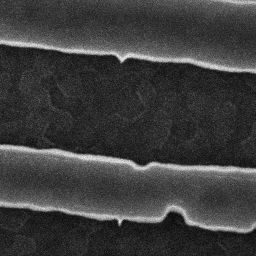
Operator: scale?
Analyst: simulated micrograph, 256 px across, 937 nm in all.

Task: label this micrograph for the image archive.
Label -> one or a few lines or trenches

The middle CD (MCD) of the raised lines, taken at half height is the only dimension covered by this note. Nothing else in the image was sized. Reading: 211 nm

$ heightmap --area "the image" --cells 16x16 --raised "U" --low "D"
UUUUUUUUUUUUUUUU
UUUUUUUUUUUUUUUU
UUUUUUUUUUUUUUUU
DDDDDDDUUUUUUUUU
DDDDDDDDDDDDDDDD
DDDDDDDDDDDDDDDD
DDDDDDDDDDDDDDDD
DDDDDDDDDDDDDDDD
DDDDDDDDDDDDDDDD
UUUUDDDDDDDDDDDD
UUUUUUUUUUUUUDDD
UUUUUUUUUUUUUUUU
UUUUUUUUUUUUUUUU
DDDDDDUUUUDUUUUU
DDDDDDDDDDDDDDDD
DDDDDDDDDDDDDDDD